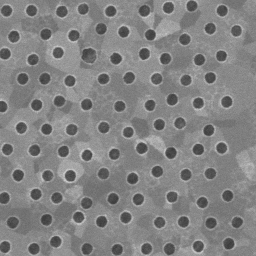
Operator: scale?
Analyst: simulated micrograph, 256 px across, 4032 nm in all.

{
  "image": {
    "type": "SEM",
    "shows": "a regular array of holes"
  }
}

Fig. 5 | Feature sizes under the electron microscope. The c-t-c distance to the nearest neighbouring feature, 358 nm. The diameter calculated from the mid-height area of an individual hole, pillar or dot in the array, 187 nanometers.